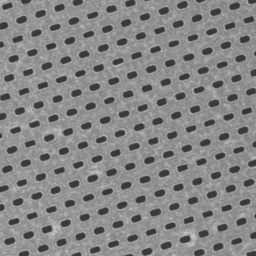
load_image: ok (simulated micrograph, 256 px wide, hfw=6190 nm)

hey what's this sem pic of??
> a regular array of holes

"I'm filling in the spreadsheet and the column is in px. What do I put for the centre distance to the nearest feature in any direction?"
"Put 19.4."